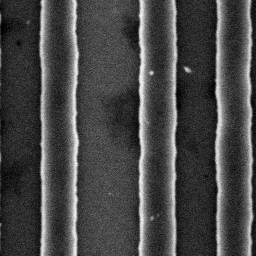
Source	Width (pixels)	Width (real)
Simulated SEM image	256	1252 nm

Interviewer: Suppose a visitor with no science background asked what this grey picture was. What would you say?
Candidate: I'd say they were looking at lines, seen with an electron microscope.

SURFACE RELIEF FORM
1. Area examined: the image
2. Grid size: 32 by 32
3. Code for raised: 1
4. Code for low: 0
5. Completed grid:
00000111110000000011110000011110
00000111100000000111110000011110
00000111100000000111110000011110
00000111100000000111110000011110
00000111100000000111110000011110
00000111110000000111110000011110
00000111110000000011110000011110
00000111110000000011110000011110
00000111110000000011110000011110
00000111110000000111110000011110
00000111110000000111110000011110
00000111100000000111110000011110
00000111100000000011110000011110
00000111100000000111110000011110
00000111100000000111110000011110
00000111100000000111110000011110
00000111110000000111110000011110
00000111110000000111110000011110
00000111110000000011110000011110
00000111110000000011110000011110
00000111110000000111110000011110
00000111110000000111110000011110
00000111110000000111110000011110
00000111100000000111110000011110
00000111110000000111110000011110
00000111110000000111110000011110
00000111100000000111110000011110
00000111110000000011110000011110
00000111100000000011110000011110
00000111110000000011110000011110
00000111110000000111110000011110
00000111110000000111110000011110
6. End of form